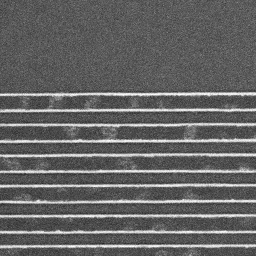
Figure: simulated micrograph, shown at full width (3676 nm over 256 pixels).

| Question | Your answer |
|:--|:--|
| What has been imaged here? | parallel lines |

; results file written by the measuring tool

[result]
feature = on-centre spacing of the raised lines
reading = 30.4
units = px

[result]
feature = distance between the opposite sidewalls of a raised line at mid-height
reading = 235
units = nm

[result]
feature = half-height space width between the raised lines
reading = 198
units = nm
